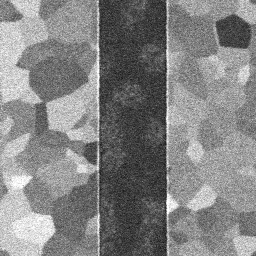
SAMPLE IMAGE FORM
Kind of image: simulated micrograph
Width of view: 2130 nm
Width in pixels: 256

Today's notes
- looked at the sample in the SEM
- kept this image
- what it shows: one or a few lines or trenches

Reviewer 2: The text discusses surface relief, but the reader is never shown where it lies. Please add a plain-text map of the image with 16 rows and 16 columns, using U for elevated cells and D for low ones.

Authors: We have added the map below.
UUUUUUDDDDUUUUUU
UUUUUUDDDDUUUUUU
UUUUUUDDDDUUUUUU
UUUUUUDDDDUUUUUU
UUUUUUDDDDUUUUUU
UUUUUUDDDDUUUUUU
UUUUUUDDDDUUUUUU
UUUUUUDDDDUUUUUU
UUUUUUDDDDUUUUUU
UUUUUUDDDDUUUUUU
UUUUUUDDDDUUUUUU
UUUUUUDDDDUUUUUU
UUUUUUDDDDUUUUUU
UUUUUUDDDDUUUUUU
UUUUUUDDDDUUUUUU
UUUUUUDDDDUUUUUU